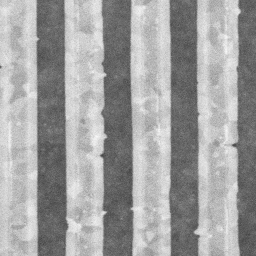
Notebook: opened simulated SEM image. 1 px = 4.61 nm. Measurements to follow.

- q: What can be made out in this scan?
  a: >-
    one or a few lines or trenches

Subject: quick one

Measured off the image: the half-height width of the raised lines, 126 nm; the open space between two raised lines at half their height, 180 nanometres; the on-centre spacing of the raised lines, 307 nanometers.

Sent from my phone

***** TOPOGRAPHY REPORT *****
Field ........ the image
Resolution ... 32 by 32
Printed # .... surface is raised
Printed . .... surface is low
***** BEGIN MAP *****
####.....###.....###.....####...
####.....###.....###.....####...
####.....###.....###.....####...
####.....###.....###.....####...
####.....###.....###.....####...
####.....###.....###.....####...
.###.....###.....###.....####...
.###.....###.....####....####...
.###.....###.....####....####...
.###.....###.....####....####...
####.....###.....####....####...
####.....###.....####....####...
####.....###.....####....####...
####.....###.....####.....###...
.###.....###.....####.....###...
.###.....###.....####.....###...
.###.....###.....####.....###...
.###.....###.....####....####...
.###.....###.....####.....###...
.###.....###.....####.....###...
.###.....###.....####.....###...
.###.....###.....####.....###...
.###.....###.....####.....###...
.###.....###.....####.....###...
.###.....###.....####.....###...
.###.....###.....####....####...
.###.....###.....####....####...
.###.....###.....####.....###...
.###.....###.....####....####...
.###.....###.....####....####...
.###.....###.....####.....###...
.###.....###.....####....####...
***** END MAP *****